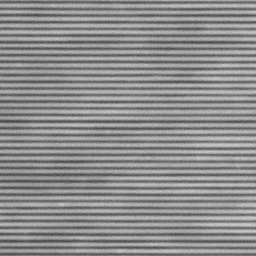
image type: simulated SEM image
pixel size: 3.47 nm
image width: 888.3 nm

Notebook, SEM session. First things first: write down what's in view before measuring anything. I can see parallel lines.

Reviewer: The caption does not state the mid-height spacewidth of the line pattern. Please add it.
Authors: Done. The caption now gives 9.1 nanometers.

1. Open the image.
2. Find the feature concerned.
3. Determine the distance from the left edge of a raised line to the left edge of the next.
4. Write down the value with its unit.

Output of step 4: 23 nm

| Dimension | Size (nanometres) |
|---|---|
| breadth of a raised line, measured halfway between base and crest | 12.2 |